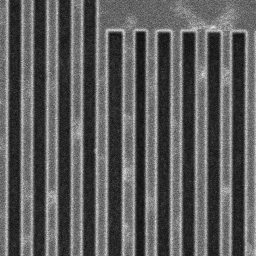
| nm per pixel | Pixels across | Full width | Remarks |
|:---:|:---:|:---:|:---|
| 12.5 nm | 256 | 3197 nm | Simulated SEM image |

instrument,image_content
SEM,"parallel lines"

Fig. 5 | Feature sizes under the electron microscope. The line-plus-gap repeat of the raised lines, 24.9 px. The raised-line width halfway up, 152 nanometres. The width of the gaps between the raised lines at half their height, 162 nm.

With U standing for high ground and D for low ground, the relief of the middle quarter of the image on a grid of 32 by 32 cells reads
DDUUUDDDUUUDDDDUUUDDDUUDDDDUUDDD
DDUUUDDDUUUDDDDUUUDDDUUDDDDUUDDD
DDUUUDDDUUUDDDDUUUDDDUUDDDDUUDDD
DDUUUDDDUUUDDDDUUUDDDUUDDDDUUDDD
DDUUUDDDUUUDDDDUUUDDDUUDDDDUUDDD
DDUUUDDDUUUDDDDUUUDDDUUDDDDUUDDD
DDUUUDDDUUUDDDDUUUDDDUUDDDDUUDDD
DDUUUDDDUUUDDDDUUUDDDUUDDDDUUDDD
DDUUUDDDUUUDDDDUUUDDDUUDDDDUUDDD
DDUUUDDDUUUDDDDUUUDDDUUDDDDUUDDD
DDUUUDDDUUUDDDDUUUDDDUUDDDDUUDDD
DDUUUDDDUUUDDDDUUUDDDUUDDDDUUDDD
DDUUUDDDUUUDDDDUUUDDDUUDDDDUUDDD
DDUUUDDDUUUDDDDUUUDDDUUDDDDUUDDD
DDUUUDDDUUUDDDDUUUDDDUUDDDDUUDDD
DDUUUDDDUUUDDDDUUUDDDUUDDDDUUDDD
DDUUUDDDUUUDDDDUUUDDDUUDDDDUUDDD
DDUUUDDDUUUDDDDUUUDDDUUDDDDUUDDD
DDUUUDDDUUUDDDDUUUDDDUUDDDDUUDDD
DDUUUDDDUUUDDDDUUUDDDUUDDDDUUDDD
DDUUUDDDUUUDDDDUUUDDDUUDDDDUUDDD
DDUUUDDDUUUDDDDUUUDDDUUDDDDUUDDD
DDUUUDDDUUUDDDDUUUDDDUUDDDDUUDDD
DDUUUDDDUUUDDDDUUUDDDUUDDDDUUDDD
DDUUUDDDUUUDDDDUUUDDDUUDDDDUUDDD
DDUUUDDDUUUDDDDUUUDDDUUDDDDUUDDD
DDUUUDDDUUUDDDDUUUDDDUUDDDDUUDDD
DDUUUDDDUUUDDDDUUUDDDUUDDDDUUDDD
DDUUUDDDUUUDDDDUUUDDDUUDDDDUUDDD
DDUUUDDDUUUDDDDUUUDDUUUDDDDUUDDD
DDUUUDDDUUUDDDDUUUDDUUUDDDDUUDDD
DDUUUDDDUUUDDDDUUUDDUUUDDDDUUDDD